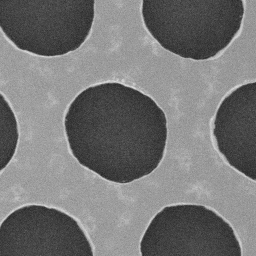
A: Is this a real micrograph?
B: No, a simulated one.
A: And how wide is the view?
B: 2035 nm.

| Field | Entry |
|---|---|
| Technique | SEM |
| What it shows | holes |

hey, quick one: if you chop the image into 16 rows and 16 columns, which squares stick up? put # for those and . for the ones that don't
......###......#
......###......#
#....#####....##
###########...##
################
######..#######.
.###......####..
.###......###...
.###......###...
.####.....####..
#####.....#####.
################
################
#...######....##
.....####......#
......###......#